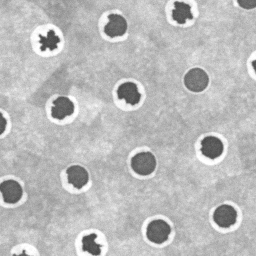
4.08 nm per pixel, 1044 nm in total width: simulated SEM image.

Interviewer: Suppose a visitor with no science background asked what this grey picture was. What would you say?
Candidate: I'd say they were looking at a regular array of holes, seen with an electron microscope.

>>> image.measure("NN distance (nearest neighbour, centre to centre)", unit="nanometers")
278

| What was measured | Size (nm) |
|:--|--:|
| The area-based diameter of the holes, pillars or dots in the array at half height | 95.9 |